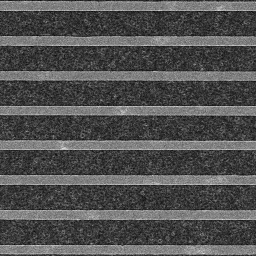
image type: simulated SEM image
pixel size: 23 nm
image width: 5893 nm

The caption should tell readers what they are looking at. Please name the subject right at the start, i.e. parallel lines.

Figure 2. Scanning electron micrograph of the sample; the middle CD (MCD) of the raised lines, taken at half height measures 204 nanometers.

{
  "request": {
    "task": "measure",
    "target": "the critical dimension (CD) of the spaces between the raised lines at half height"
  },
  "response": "590 nanometers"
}